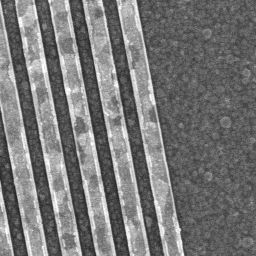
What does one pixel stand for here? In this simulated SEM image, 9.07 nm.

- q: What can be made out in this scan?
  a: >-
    parallel lines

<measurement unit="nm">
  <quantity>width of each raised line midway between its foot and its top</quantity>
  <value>167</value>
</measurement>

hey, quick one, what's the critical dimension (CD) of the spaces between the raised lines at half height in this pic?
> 140 nm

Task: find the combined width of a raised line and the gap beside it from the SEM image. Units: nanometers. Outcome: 303